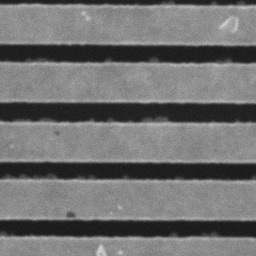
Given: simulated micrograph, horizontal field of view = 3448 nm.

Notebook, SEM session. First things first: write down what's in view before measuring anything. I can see lines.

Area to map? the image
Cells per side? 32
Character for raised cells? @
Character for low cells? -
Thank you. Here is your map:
--------------------------------
@@@@@@@@@@@@@@@@@@@@@@@@@@@@@@@@
@@@@@@@@@@@@@@@@@@@@@@@@@@@@@@@@
@@@@@@@@@@@@@@@@@@@@@@@@@@@@@@@@
@@@@@@@@@@@@@@@@@@@@@@@@@@@@@@@@
@@@@@@@@@@@@@@@@@@@@@@@@@@@@@@@@
--------------------------------
--------------------------------
@@@@@@@@@@@@@@@@@@@@@@@@@@@@@@@@
@@@@@@@@@@@@@@@@@@@@@@@@@@@@@@@@
@@@@@@@@@@@@@@@@@@@@@@@@@@@@@@@@
@@@@@@@@@@@@@@@@@@@@@@@@@@@@@@@@
@@@@@@@@@@@@@@@@@@@@@@@@@@@@@@@@
--------------------------------
--------------------------------
@@@@@@@@@@@@@@@@@@@@@@@@@@@@@@@@
@@@@@@@@@@@@@@@@@@@@@@@@@@@@@@@@
@@@@@@@@@@@@@@@@@@@@@@@@@@@@@@@@
@@@@@@@@@@@@@@@@@@@@@@@@@@@@@@@@
@@@@@@@@@@@@@@@@@@@@@@@@@@@@@@@@
--------------------------------
--------------------------------
@@@@@@@@@@-@@@@@--@@@-@-@-@-----
@@@@@@@@@@@@@@@@@@@@@@@@@@@@@@@@
@@@@@@@@@@@@@@@@@@@@@@@@@@@@@@@@
@@@@@@@@@@@@@@@@@@@@@@@@@@@@@@@@
@@@@@@@@@@@@@@@@@@@@@@@@@@@@@@@@
----@--@--@@@@@@@@@@@@@@@@@@@@@@
--------------------------------
----@---------------------------
@@@@@@@@@@@@@@@@@@@@@@@@@@@@@@@@
@@@@@@@@@@@@@@@@@@@@@@@@@@@@@@@@